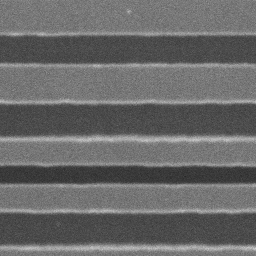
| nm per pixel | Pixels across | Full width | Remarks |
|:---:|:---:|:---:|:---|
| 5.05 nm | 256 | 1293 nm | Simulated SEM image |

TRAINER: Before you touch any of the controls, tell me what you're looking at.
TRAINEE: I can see lines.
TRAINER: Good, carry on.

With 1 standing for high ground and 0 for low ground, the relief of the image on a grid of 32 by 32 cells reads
11111111111111111111111111111111
11111111111111111111111111111111
11111111111111111111111111111111
11111111111111111111111111111111
00000000000000000000000000000000
00000000000000000000000000000000
00000000000000000000000000000000
00000000000000000000000000000000
11111111111111111111111111111111
11111111111111111111111111111111
11111111111111111111111111111111
11111111111111111111111111111111
11111111111111111111111111111111
00000000000000000000000000000000
00000000000000000000000000000000
00000000000000000000000000000000
00000000000000000000000000000000
11111111111111111111111111111111
11111111111111111111111111111111
11111111111111111111111111111111
11111111111111111111111111111111
00000000000000000000000000000000
00000000000000000000000000000000
11111111111111111111111111111111
11111111111111111111111111111111
11111111111111111111111111111111
00000000000000000000000000000000
00000000000000000000000000000000
00000000000000000000000000000000
00000000000000000000000000000000
00000000000000000000000000000000
11111111111111111111111111111111